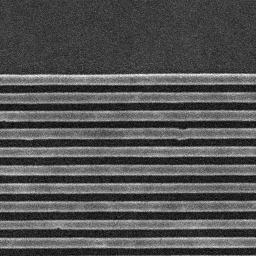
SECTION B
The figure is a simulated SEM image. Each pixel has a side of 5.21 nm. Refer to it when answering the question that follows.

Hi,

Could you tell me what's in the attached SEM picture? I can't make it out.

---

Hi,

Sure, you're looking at parallel lines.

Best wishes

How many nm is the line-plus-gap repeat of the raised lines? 94.5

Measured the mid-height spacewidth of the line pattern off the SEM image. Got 41.7 nm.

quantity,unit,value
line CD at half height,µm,0.0515